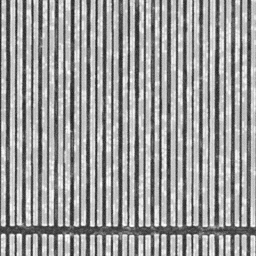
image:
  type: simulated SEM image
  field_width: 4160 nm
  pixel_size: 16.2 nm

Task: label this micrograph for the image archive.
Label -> parallel lines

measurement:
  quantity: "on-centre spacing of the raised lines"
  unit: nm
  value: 131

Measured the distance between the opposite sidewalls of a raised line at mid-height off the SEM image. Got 69 nm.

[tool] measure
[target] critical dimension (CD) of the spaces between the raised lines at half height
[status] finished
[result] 0.069 µm